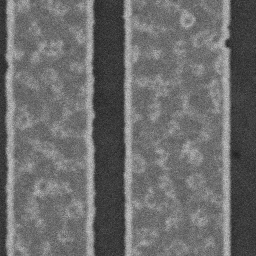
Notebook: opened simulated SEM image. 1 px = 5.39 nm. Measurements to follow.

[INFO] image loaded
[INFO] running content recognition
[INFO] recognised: one or a few lines or trenches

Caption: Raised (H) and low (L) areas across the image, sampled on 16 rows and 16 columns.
LHHHHHLLHHHHHHLL
LHHHHHLLHHHHHHLL
LHHHHHLLHHHHHHLL
LHHHHHLLHHHHHHLL
LHHHHHLLHHHHHHLL
LHHHHHLLHHHHHHLL
LHHHHHLLHHHHHHLL
LHHHHHLLHHHHHHLL
LHHHHHLLHHHHHHLL
LHHHHHLLHHHHHHLL
LHHHHHLLHHHHHHLL
LHHHHHLLHHHHHHLL
LHHHHHLLHHHHHHLL
LHHHHHLLHHHHHHLL
LHHHHHLLHHHHHHLL
LHHHHHLLHHHHHHLL